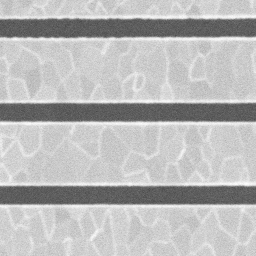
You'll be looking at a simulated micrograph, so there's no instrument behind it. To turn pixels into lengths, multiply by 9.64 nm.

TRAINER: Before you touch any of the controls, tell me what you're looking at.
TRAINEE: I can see lines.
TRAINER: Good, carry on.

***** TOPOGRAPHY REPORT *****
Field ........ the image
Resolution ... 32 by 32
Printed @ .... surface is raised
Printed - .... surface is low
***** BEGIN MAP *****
@@@@@@@@@@@@@@@@@@@@@@@@@@@@@@@@
@@@@@@@@@@@@@@@@@@@@@@@@@@@@@@@@
--------------------------------
--------------------------------
--------------------------------
@@@@@@@@@@@@@@@@@@@@@@@@@@@@@@@@
@@@@@@@@@@@@@@@@@@@@@@@@@@@@@@@@
@@@@@@@@@@@@@@@@@@@@@@@@@@@@@@@@
@@@@@@@@@@@@@@@@@@@@@@@@@@@@@@@@
@@@@@@@@@@@@@@@@@@@@@@@@@@@@@@@@
@@@@@@@@@@@@@@@@@@@@@@@@@@@@@@@@
@@@@@@@@@@@@@@@@@@@@@@@@@@@@@@@@
@@@@@@@@@@@@@@@@@@@@@@@@@@@@@@@@
--------------------------------
--------------------------------
@@@@@@@@@@@@@@@@@@@@@@@@@@@@@@@@
@@@@@@@@@@@@@@@@@@@@@@@@@@@@@@@@
@@@@@@@@@@@@@@@@@@@@@@@@@@@@@@@@
@@@@@@@@@@@@@@@@@@@@@@@@@@@@@@@@
@@@@@@@@@@@@@@@@@@@@@@@@@@@@@@@@
@@@@@@@@@@@@@@@@@@@@@@@@@@@@@@@@
@@@@@@@@@@@@@@@@@@@@@@@@@@@@@@@@
@@@@@@@@@@@@@@@@@@@@@@@@@@@@@@@@
--------------------------------
--------------------------------
--------------------------------
@@@@@@@@@@@@@@@@@@@@@@@@@@@@@@@@
@@@@@@@@@@@@@@@@@@@@@@@@@@@@@@@@
@@@@@@@@@@@@@@@@@@@@@@@@@@@@@@@@
@@@@@@@@@@@@@@@@@@@@@@@@@@@@@@@@
@@@@@@@@@@@@@@@@@@@@@@@@@@@@@@@@
@@@@@@@@@@@@@@@@@@@@@@@@@@@@@@@@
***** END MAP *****